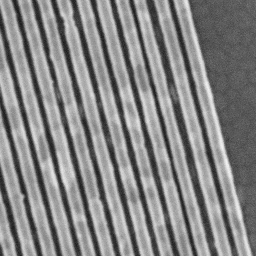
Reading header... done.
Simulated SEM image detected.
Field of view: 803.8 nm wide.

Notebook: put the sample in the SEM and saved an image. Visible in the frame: parallel lines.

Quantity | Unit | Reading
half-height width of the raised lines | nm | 32.8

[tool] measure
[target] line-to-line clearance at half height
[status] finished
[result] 27.1 nm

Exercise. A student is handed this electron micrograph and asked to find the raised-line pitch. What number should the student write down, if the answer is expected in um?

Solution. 0.0595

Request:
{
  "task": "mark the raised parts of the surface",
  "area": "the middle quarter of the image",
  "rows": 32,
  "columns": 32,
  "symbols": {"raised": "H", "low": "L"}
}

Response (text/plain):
LLLHHLLHHHLLHHHLLHHHLLHHLLLHHHLL
HLLHHHLLHHHLLHHLLLHHLLHHHLLHHHLL
HLLHHHLLHHHLLHHHLLHHLLHHHLLLHHLL
HLLHHHLLHHHLLHHHLLHHHLLHHLLLHHLL
HHLLHHLLLHHLLLHHLLHHHLLHHLLLHHHL
HHLLHHHLLHHLLLHHLLLHHLLHHLLLHHHL
HHLLHHHLLHHHLLHHHLLHHHLHHHLLLHHL
HHLLLHHLLHHHLLHHHLLHHHLLHHLLLHHL
HHLLLHHHLLHHLLLHHLLHHHLLHHLLLHHH
HHHLLHHHLLHHLLLHHHLLHHLLHHHLLHHH
HHHLLHHHLLHHHLLHHHLLHHHLHHHLLLHH
LHHLLHHHLLHHHLLHHHLLHHHLLHHLLLHH
LHHLLLHHLLHHHLLHHHLLHHHLLHHLLLHH
LHHHLLHHLLLHHLLLHHHLLHHLLHHLLLHH
LHHHLLHHHLLHHHLLHHHLLHHLLLHHLLLH
LLHHLLLHHLLHHHLLHHHLLHHHLLHHLLLH
LLHHHLLHHLLHHHLLHHHLLHHHLLHHLLLH
LLHHHLLHHLLLHHHLLHHLLLHHLLHHLLLH
LLHHHLLHHHLLHHHLLHHHLLHHLLHHHLLL
LLLHHLLLHHLLHHHLLHHHLLHHHLLHHLLL
HLLHHHLLHHLLLHHLLHHHLLLHHLLHHLLL
HLLHHHLLHHHLLHHLLLHHLLLHHLLHHHLL
HLLHHHLLHHHLLHHHLLHHHLLHHHLHHHLL
HLLLHHLLLHHLLHHHLLHHHLLHHHLHHHLL
HLLLHHHLLHHLLLHHLLHHHLLHHHLLHHLL
HHLLHHHLLHHHLLHHLLLHHLLLHHLLHHHL
HHLLHHHLLHHHLLHHHLLHHHLLHHHLHHHL
HHLLLHHLLLHHLLHHHLLHHHLLHHHLHHHL
HHHLLHHHLLHHLLLHHLLHHHLLHHHLLHHL
HHHLLHHHLLHHHLLHHHLLHHLLLHHLLHHL
LHHLLHHHLLHHHLLHHHLLHHHLLHHHLHHH
LHHLLLHHLLHHHLLLHHLLHHHLLHHHLHHH